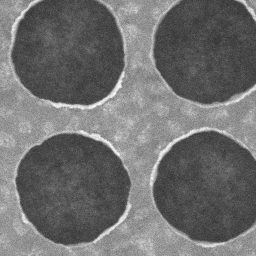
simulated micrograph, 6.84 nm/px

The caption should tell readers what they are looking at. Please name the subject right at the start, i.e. holes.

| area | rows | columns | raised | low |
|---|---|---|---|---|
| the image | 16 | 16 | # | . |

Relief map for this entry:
##.....####....#
#......###......
#.......##......
#.......##......
#.......##......
##.....####.....
####..######.###
################
###..#######..##
##.....###......
#.......##......
#.......##......
#.......##......
##......##......
##.....####....#
################